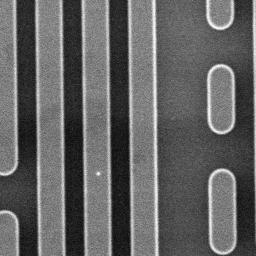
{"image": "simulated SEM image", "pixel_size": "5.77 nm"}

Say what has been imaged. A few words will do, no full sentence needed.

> groups of lines, slits or small figures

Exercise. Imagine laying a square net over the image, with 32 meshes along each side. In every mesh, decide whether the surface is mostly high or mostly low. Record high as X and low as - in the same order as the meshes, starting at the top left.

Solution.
XX---XXX--XXX---XXX-------XXX---
XX---XXX--XXX---XXX-------XXX---
XX---XXX--XXX---XXX-------XXX---
XX---XXX--XXX---XXX--------X----
XX---XXX--XXX---XXX-------------
XX---XXX--XXX---XXX-------------
XX---XXX--XXX---XXX-------------
XX---XXX--XXXX--XXX-------------
XX---XXX--XXXX--XXX--------XX---
XX---XXX--XXXX--XXX-------XXX---
XX---XXX---XXX--XXX-------XXX---
XX---XXX---XXX--XXX-------XXX---
XX---XXX---XXX--XXX-------XXX---
XX---XXX---XXX--XXX-------XXX---
XX---XXX---XXX--XXX-------XXX---
XX---XXX---XXX--XXX-------XXX---
XX---XXX---XXX--XXX--------X----
XX---XXX---XXX--XXX-------------
XX---XXX---XXX--XXX-------------
XX---XXX---XXX--XXX-------------
XX---XXX---XXX--XXX-------------
X----XXX---XXX--XXX--------XX---
-----XXX---XXX--XXX-------XXX---
-----XXX---XXX--XXX-------XXX---
-----XXX---XXX--XXXX------XXX---
-----XXX---XXX--XXXX------XXX---
X----XXX---XXX--XXXX------XXX---
XX---XXX---XXX--XXXX------XXX---
XX---XXX---XXX---XXX------XXX---
XX---XXX---XXX---XXX------XXX---
XX---XXX---XXX---XXX------XXX---
XX---XXX---XXX---XXX-------XX---